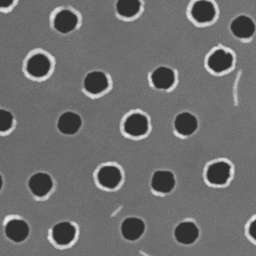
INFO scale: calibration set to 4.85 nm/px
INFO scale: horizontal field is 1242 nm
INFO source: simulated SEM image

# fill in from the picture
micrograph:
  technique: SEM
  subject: a regular array of holes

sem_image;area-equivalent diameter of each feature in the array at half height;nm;112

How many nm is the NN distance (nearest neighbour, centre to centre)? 244